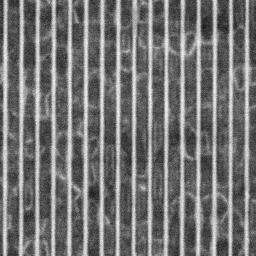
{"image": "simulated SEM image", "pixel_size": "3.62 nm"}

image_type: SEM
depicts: parallel lines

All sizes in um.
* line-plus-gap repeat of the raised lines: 0.0583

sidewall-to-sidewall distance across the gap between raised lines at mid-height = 47.9 nm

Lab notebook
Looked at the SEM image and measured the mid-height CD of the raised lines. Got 9.9 nanometres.